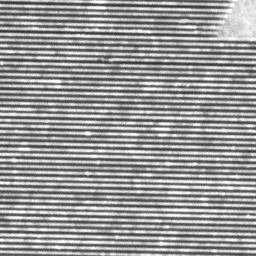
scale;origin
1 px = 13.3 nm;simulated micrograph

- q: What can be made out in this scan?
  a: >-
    parallel lines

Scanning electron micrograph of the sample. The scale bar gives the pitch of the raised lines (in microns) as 0.0762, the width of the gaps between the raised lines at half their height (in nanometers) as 46.6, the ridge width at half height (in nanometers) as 34.9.